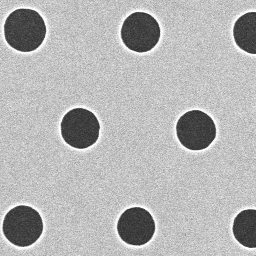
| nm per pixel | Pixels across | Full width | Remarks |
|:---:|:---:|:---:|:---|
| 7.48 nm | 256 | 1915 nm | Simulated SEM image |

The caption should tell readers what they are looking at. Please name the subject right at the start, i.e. holes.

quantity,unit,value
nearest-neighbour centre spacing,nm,842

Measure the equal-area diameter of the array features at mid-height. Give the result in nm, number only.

302